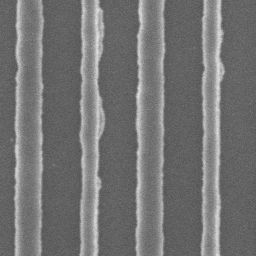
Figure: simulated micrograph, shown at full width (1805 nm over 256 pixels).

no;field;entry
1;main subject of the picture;lines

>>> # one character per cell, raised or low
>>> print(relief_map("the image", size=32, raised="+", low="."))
..+++.....++.....++++.....+.....
..+++.....++.....+++.....++.....
..+++.....++.....+++.....++.....
..+++.....++.....+++.....++.....
..+++.....++.....+++.....++.....
..+++.....++.....++++....++.....
..+++.....++.....++++....++.....
..+++.....++.....+++.....++.....
..+++.....++.....+++......+.....
..+++.....++.....+++.....++.....
..+++.....++.....+++.....++.....
..+++.....++.....+++.....++.....
..+++.....++.....+++.....++.....
..+++.....++.....+++.....++.....
..+++.....++.....+++.....++.....
..+++.....++.....+++.....++.....
..+++.....++.....+++......+.....
..+++.....++.....+++.....++.....
..+++.....++.....+++.....++.....
..+++.....++.....+++.....++.....
..+++.....++.....+++.....++.....
..+++.....++.....+++.....++.....
..+++.....++.....+++.....++.....
..+++.....++.....+++.....++.....
..+++.....++.....+++.....++.....
..+++.....++.....+++.....++.....
..+++.....++.....+++.....++.....
..+++.....++.....+++.....++.....
..+++.....++.....+++.....++.....
..+++.....++.....+++.....++.....
..+++.....++.....+++.....++.....
..+++.....++.....+++.....++.....